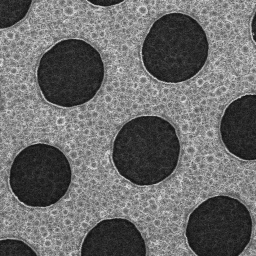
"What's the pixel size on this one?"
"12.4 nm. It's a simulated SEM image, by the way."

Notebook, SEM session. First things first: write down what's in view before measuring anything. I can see holes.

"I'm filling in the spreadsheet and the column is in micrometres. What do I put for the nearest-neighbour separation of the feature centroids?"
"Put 1.32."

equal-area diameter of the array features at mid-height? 841 nm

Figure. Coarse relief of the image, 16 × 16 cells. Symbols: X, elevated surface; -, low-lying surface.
--XXXXXXXXXXXXXX
-XXXXXXXXX--XXXX
XXXX-XXXX----XXX
XXX---XXX----XXX
XX----XXX---XXXX
XXX---XXXXXXXXXX
XXX--XXXXXXXXX--
XXXXXXXX--XXXX--
XXXXXXX----XXX--
X---XXX----XXX--
X---XXX----XXXXX
X---XXXXX-XXXXXX
X---XXXXXXXXX--X
XXXXXXXXXXXX----
XXXXXX---XXX----
--XXX----XXX---X